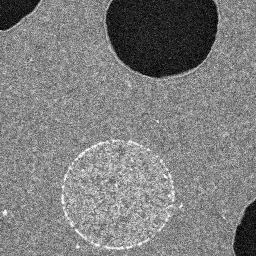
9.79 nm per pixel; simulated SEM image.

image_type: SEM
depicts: holes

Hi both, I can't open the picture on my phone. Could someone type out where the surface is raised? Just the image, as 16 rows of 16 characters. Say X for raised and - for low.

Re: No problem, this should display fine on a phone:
--XXXXX-------XX
-XXXXXX-------XX
XXXXXXX------XXX
XXXXXXX------XXX
XXXXXXXX----XXXX
XXXXXXXXXXXXXXXX
XXXXXXXXXXXXXXXX
XXXXXXXXXXXXXXXX
XXXXXXXXXXXXXXXX
XXXXXXXXXXXXXXXX
XXXXXXXXXXXXXXXX
XXXXXXXXXXXXXXXX
XXXXXXXXXXXXXXXX
XXXXXXXXXXXXXXX-
XXXXXXXXXXXXXXX-
XXXXXXXXXXXXXXX-